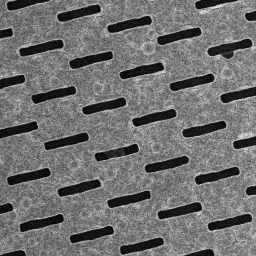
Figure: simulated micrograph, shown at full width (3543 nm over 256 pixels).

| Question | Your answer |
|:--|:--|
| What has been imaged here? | a regular array of holes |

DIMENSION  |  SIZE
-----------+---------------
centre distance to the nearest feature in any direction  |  668 nm